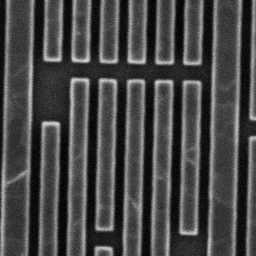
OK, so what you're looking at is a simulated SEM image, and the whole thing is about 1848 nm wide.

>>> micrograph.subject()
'groups of lines, slits or small figures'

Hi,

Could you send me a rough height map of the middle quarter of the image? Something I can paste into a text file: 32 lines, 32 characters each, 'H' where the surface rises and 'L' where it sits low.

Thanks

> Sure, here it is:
LLLLLLLLLLLLLLLLLLLLLLLLLLLLLLLL
LLLLLLLLLLLLLLLLLLLLLLLLLLLLLLLL
LLLLLLLLLLLLLLLLLLLLLLLLLLLLLLLL
LLLLLLLLLLLLLLLLLLLLLLLLLLLLLLLL
LLHHHHLLLHHHHLLLHHHHLLLHHHHLLLHH
LLHHHHLLLHHHHLLLHHHHLLLHHHHLLLHH
LLHHHHLLLHHHHLLLHHHHLLLHHHHLLLHH
LLHHHHLLLHHHHLLLHHHHLLLHHHHLLLHH
LLHHHHLLLHHHHLLLHHHHLLLHHHHLLLHH
LLHHHHLLLHHHHLLLHHHHLLLHHHHLLLHH
LLHHHHLLLHHHHLLLHHHHLLLHHHHLLLHH
LLHHHHLLLHHHHLLLHHHHLLLHHHHLLLHH
LLHHHHLLLHHHHLLLHHHHLLLHHHHLLLHH
LLHHHHLLLHHHHLLLHHHHLLLHHHHLLLHH
LLHHHHLLLHHHHLLLHHHHLLLHHHHLLLHH
LLHHHHLLLHHHHLLLHHHHLLLHHHHLLLHH
LLHHHHLLLHHHHLLLHHHHLLLHHHHLLLHH
LLHHHHLLLHHHHLLLHHHHLLLHHHHLLLHH
LLHHHHLLLHHHHLLLHHHHLLLHHHHLLLHH
LLHHHHLLLHHHHLLLHHHLLLLHHHHLLLHH
LLHHHHLLLHHHLLLLHHHLLLLHHHHLLLHH
LLHHHHLLLHHHLLLLHHHLLLLHHHHLLLHH
LLHHHLLLLHHHLLLLHHHLLLLHHHHLLLHH
LLHHHLLLLHHHLLLLHHHLLLLHHHHLLLHH
LLHHHLLLLHHHLLLLHHHLLLLHHHHLLLHH
LLHHHLLLLHHHLLLLHHHLLLLHHHHLLLHH
LLHHHLLLLHHHLLLLHHHLLLLHHHLLLLHH
LLHHHLLLLHHHLLLLHHHLLLHHHHLLLLHH
LLHHHLLLLHHHLLLHHHHLLLHHHHLLLLHH
LLHHHLLLHHHHLLLHHHHLLLHHHHLLLLHH
LLHHHLLLHHHHLLLHHHHLLLHHHHLLLLHH
LHHHHLLLHHHHLLLHHHHLLLHHHHLLLLHH